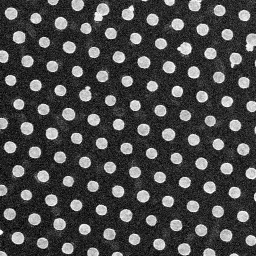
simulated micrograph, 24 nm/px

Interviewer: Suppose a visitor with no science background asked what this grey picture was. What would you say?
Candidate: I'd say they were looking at a regular array of raised bodies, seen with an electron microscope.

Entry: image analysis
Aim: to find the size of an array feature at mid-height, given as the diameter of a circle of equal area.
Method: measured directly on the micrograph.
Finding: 266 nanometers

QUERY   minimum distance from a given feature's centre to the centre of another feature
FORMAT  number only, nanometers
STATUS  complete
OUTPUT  602